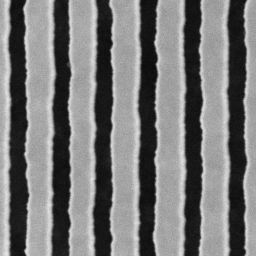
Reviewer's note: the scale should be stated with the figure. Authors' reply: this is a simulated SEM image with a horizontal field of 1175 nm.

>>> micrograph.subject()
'lines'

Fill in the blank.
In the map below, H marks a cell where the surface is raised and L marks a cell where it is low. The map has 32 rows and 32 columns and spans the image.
HLLHHHHLLHHHLLHHHHLLHHHLLHHHHLLH
HLLHHHHLLHHHLLHHHHLLHHHLLHHHHLLH
HLLHHHHLLHHHLLHHHHLLHHHLLHHHLLLH
HLLHHHHLLHHHLLHHHHLLHHHLLHHHLLLH
HLLHHHHLLHHHLLHHHHLHHHHLLHHHHLLH
HLLHHHHLLHHHLLHHHHLHHHHLLHHHHLLH
HLLHHHHLLHHHLLHHHHLLHHHLLHHHHLLH
HLLHHHHLLHHHLLHHHHLLHHHLLHHHHLLH
HLLHHHHLLHHHLLHHHHLLHHHLLHHHHLLH
HLLHHHHLLHHHLLHHHHLLHHHLLHHHHLLH
HLLHHHHLLHHHLLHHHHLLHHHLLHHHHLLH
HLLHHHHLLHHHLLHHHLLHHHHLLHHHLLLH
HLLHHHHLLHHHLLHHHLLHHHHLLHHHHLHH
HLLHHHHLLHHHLLHHHLLHHHHLLHHHHLLH
HLLHHHHLLHHHLLHHHLLLHHHLLHHHHLLH
HLLLHHHLLHHHLLHHHHLHHHHLLHHHHLLH
HLLHHHHLLHHHLLHHHHLLHHHLLHHHHLLH
HLLHHHHLLHHHLLHHHHLLHHHLLHHHHLLH
HLLHHHHLLHHHLLHHHHLLHHHLLHHHHLLH
HLLHHHHLLHHHLLHHHLLHHHHLLHHHHLLH
HLLHHHHLLHHHLLHHHLLHHHHLLHHHHLLH
HLLHHHHLLHHHLLHHHLLHHHHLLHHHHLLH
HLLHHHHLLHHHLLHHHLLHHHHLLHHHHLHH
HLLLHHHLLHHHLLHHHLLHHHHLLHHHHLHH
HLLLHHHLLHHHLLHHHLLHHHHLLHHHHLLH
HLLHHHHLLHHHLLHHHLLHHHHLLHHHHLLH
HLLLHHHLLHHHLLHHHLLHHHHLLHHHHLLH
HLLHHHHLLHHHLLHHHHLHHHHLLHHHHLLH
HLLHHHHLLHHHLLHHHLLHHHHLLHHHHLLH
HLLHHHHLLHHHLLHHHLLHHHHLLHHHHLLH
HLLHHHHLLHHHLLHHHLLHHHHLLHHHHLLH
HLLHHHHLLHHHLLHHHLLHHHHLLHHHHLLH